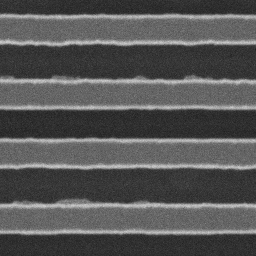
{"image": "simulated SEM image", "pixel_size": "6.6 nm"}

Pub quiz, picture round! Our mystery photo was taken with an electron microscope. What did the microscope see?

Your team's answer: lines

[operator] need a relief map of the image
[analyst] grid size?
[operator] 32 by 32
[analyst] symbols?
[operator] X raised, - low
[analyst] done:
--------------------------------
--------------------------------
XXXXXXXXXXXXXXXXXXXXXXXXXXXXXXXX
XXXXXXXXXXXXXXXXXXXXXXXXXXXXXXXX
XXXXXXXXXXXXXXXXXXXXXXXXXXXXXXXX
XXXXXXXXXXXXXXXXXXXXXXXXXXXXXXXX
--------------------------------
--------------------------------
--------------------------------
--------------------------------
XXXXXXXXXXXXXXXXXXXXXXXXXXXXXXXX
XXXXXXXXXXXXXXXXXXXXXXXXXXXXXXXX
XXXXXXXXXXXXXXXXXXXXXXXXXXXXXXXX
XXXXXXXXXXXXXXXXXXXXXXXXXXXXXXXX
--------------------------------
--------------------------------
--------------------------------
XXXXXXXXXXXXXXXXXXXXXXXXXXXXXXXX
XXXXXXXXXXXXXXXXXXXXXXXXXXXXXXXX
XXXXXXXXXXXXXXXXXXXXXXXXXXXXXXXX
XXXXXXXXXXXXXXXXXXXXXXXXXXXXXXXX
--------------------------------
--------------------------------
--------------------------------
--------------------------------
-X-----X----XXX---XX-----X------
XXXXXXXXXXXXXXXXXXXXXXXXXXXXXXXX
XXXXXXXXXXXXXXXXXXXXXXXXXXXXXXXX
XXXXXXXXXXXXXXXXXXXXXXXXXXXXXXXX
--------------------------------
--------------------------------
--------------------------------